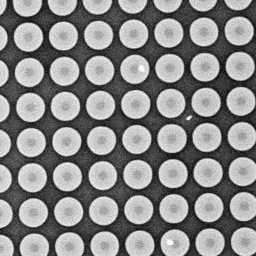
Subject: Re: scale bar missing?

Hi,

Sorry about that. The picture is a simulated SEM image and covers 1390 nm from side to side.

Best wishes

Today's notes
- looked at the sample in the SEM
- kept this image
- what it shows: an array of small figures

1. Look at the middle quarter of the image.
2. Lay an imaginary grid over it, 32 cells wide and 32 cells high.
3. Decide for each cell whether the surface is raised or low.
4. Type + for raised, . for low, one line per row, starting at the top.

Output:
++++.+++++++..+++++++..+++++++..
++++.+++++++..+++++++..+++++++..
++++..++++++..+++++++..+++++++..
+++...++++++...+++++....+++++...
++.....++++.....+++.............
................................
.........................+++....
++.....++++....+++++....+++++...
+++...++++++...++++++..+++++++..
++++..+++++++.+++++++..+++++++..
++++..+++++++.+++++++..+++++++..
++++..+++++++..++++++...++++++..
+++...++++++...++++++...+++++...
++......+++......++.............
................................
.................++......++++...
+++....+++++....+++++...++++++..
++++..+++++++..++++++...++++++..
++++..+++++++..+++++++.+++++++..
++++..+++++++..+++++++..++++++..
++++..+++++++..++++++...++++++..
++++...+++++....+++++....++++...
++......+++.....................
................................
.................+++.....++++...
+++....+++++....+++++...++++++..
++++...++++++..+++++++..+++++++.
++++..+++++++..+++++++..+++++++.
++++..+++++++..+++++++..+++++++.
++++...++++++..++++++...++++++..
++++...+++++....+++++....++++...
++..............................